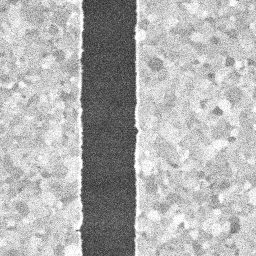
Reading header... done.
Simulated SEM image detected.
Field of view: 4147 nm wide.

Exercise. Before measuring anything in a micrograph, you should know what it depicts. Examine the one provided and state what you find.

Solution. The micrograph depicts one or a few lines or trenches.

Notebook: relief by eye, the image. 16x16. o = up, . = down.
ooooo....ooooooo
ooooo....ooooooo
ooooo....ooooooo
ooooo....ooooooo
ooooo....ooooooo
ooooo....ooooooo
ooooo....ooooooo
ooooo....ooooooo
ooooo....ooooooo
ooooo....ooooooo
ooooo....ooooooo
ooooo....ooooooo
ooooo....ooooooo
ooooo....ooooooo
ooooo....ooooooo
ooooo....ooooooo